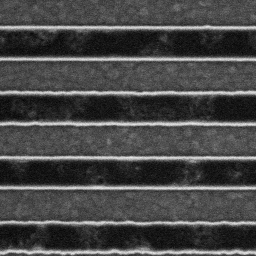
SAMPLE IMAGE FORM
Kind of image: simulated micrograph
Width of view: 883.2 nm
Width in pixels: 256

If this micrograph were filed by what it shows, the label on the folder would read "one or a few lines or trenches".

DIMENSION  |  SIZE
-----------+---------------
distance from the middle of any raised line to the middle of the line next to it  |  223 nanometers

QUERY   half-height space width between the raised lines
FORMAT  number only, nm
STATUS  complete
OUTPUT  114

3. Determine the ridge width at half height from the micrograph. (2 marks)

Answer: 111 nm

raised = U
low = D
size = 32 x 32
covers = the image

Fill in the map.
DDDDDDDDDDDDDDDDDDDDDDDDDDDDDDDD
DDDDDDDDDDDDDDDDDDDDDDDDDDDDDDDD
DDDDDDDDDDDDDDDDDDDDDDDDDDDDDDDD
UUUUUUUUUUUUUUDDDUUDDUUDDUUDDDUU
UUUUUUUUUUUUUUUUUUUUUUUUUUUUUUUU
UUUUUUUUUUUUUUUUUUUUUUUUUUUUUUUU
UUUUUUUUUUUUUUUUUUUUUUUUUUUUUUUU
DDDDDDDDDDDDDDDDDDDDDDDDDDDDDDDD
DDDDDDDDDDDDDDDDDDDDDDDDDDDDDDDD
DDDDDDDDDDDDDDDDDDDDDDDDDDDDDDDD
DDDDDDDDDDDDDDDDDDDDDDDDDDDDDDDD
DDDDDDDDDDDDDDDDDDDDDDDDDDDDDDDD
UUUUUUUUUUUUUUUUUUUUUUUUUUUUUUUU
UUUUUUUUUUUUUUUUUUUUUUUUUUUUUUUU
UUUUUUUUUUUUUUUUUUUUUUUUUUUUUUUU
UUUUUUUDDUUUUUUUUUUUUUUDUUUUUUUU
DDDDDDDDDDDDDDDDDDDDDDDDDDDDDDDD
DDDDDDDDDDDDDDDDDDDDDDDDDDDDDDDD
DDDDDDDDDDDDDDDDDDDDDDDDDDDDDDDD
DDDDDDDDDDDDDDDDDDDDDDDDDDDDDDDD
UUUUUUUUUUUUUUUUUUUUUUUUUUUUUUUU
UUUUUUUUUUUUUUUUUUUUUUUUUUUUUUUU
UUUUUUUUUUUUUUUUUUUUUUUUUUUUUUUU
UUUUUUUUUUUUUUUUUUUUUUUUUUUUUUUU
DDDDDDDDDDDDDDDDDDDDDDDDDDDDDDDD
DDDDDDDDDDDDDDDDDDDDDDDDDDDDDDDD
DDDDDDDDDDDDDDDDDDDDDDDDDDDDDDDD
DDDDDDDDDDDDDDDDDDDDDDDDDDDDDDDD
UUUUUUUUUUUUUUUUUUUUUUUUUUUUUUUU
UUUUUUUUUUUUUUUUUUUUUUUUUUUUUUUU
UUUUUUUUUUUUUUUUUUUUUUUUUUUUUUUU
UDDUUUUUUUUUUUDUDDUUUUUDUUUUUDUU